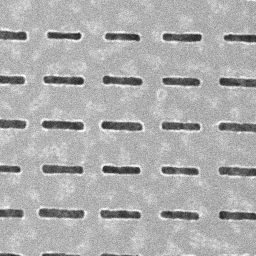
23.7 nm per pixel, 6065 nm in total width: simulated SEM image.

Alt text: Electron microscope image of a regular array of holes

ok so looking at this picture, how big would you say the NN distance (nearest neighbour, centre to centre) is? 1040 nm